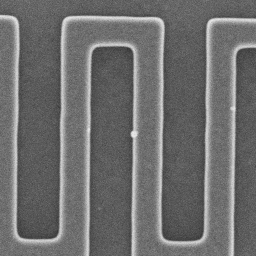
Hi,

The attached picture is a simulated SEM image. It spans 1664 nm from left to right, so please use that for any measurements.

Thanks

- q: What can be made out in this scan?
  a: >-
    groups of lines, slits or small figures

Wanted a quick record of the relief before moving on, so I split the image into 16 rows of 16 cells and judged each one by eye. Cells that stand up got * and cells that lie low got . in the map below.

................
*...******...***
*...******...***
*...**..**...**.
*...**..**...**.
*...**..**...**.
*...**..**...**.
*...**..**...**.
*...**..**...**.
*...**..**...**.
*...**..**...**.
*...**..**...**.
*...**..**...**.
*...**..**...**.
*...*...**...**.
*****...*******.